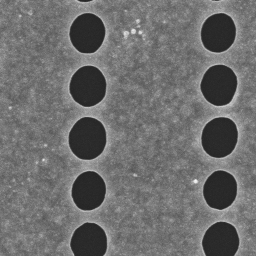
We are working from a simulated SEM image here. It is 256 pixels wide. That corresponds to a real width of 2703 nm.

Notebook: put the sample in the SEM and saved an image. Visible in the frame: a regular array of holes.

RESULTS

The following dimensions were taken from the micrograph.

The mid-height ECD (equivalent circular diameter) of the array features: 406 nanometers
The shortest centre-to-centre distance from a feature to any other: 552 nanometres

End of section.